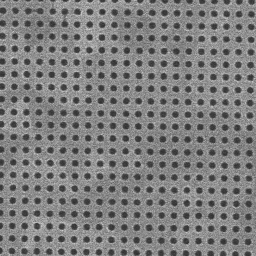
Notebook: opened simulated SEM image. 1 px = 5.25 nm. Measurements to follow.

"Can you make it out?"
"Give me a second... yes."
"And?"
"a regular array of holes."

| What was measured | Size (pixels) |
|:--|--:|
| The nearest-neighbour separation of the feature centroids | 12.1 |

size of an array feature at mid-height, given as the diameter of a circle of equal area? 0.0384 um